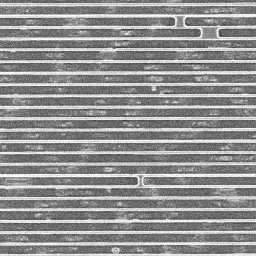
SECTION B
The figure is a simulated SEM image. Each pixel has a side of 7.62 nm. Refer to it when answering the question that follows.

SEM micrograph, parallel lines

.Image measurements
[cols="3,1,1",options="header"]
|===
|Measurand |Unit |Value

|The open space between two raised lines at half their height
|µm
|0.0658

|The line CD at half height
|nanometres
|19.1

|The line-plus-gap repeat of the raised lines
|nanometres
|87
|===